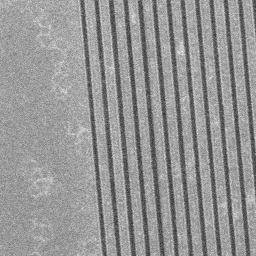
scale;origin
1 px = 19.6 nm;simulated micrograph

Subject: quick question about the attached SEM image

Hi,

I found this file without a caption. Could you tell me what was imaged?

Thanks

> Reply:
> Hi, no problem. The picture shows parallel lines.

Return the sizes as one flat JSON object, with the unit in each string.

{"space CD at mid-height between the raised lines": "0.115 µm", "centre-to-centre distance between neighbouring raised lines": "281 nanometres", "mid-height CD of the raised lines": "166 nm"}